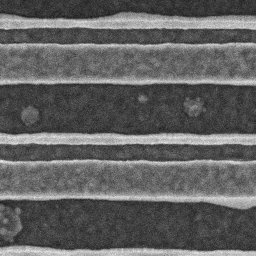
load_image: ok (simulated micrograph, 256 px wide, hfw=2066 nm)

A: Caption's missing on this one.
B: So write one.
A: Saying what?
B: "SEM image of lines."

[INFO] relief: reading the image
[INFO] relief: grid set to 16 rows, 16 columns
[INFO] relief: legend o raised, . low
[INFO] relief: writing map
................
oooooooooooooooo
oooooooooooooooo
oooooooooooooooo
oooooooooooooooo
................
................
................
ooooooo..ooo....
oooooooooooooooo
oooooooooooooooo
oooooooooooooooo
.............ooo
................
................
................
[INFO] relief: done